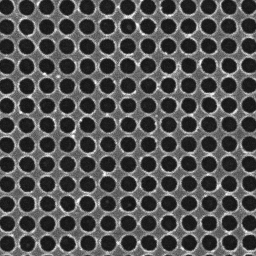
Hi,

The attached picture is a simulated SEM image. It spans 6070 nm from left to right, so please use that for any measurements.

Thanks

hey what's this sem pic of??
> a regular array of holes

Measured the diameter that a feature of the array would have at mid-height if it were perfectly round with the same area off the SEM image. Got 385 nm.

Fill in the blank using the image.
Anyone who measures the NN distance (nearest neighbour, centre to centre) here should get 0.462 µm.